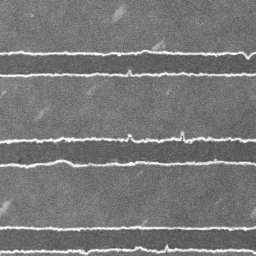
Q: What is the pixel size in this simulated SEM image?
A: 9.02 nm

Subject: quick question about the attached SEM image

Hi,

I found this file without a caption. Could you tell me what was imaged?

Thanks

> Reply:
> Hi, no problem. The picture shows one or a few lines or trenches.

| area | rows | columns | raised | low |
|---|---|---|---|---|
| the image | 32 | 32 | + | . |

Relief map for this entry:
++++++++++++++++++++++++++++++++
++++++++++++++++++++++++++++++++
++++++++++++++++++++++++++++++++
++++++++++++++++++++++++++++++++
++++++++++++++++++++++++++++++++
++++++++++++++++++++++++++++++++
++++++++++++++++++.+++++++++++++
................................
................................
.+..++++++++++++++++++++++++++++
++++++++++++++++++++++++++++++++
++++++++++++++++++++++++++++++++
++++++++++++++++++++++++++++++++
++++++++++++++++++++++++++++++++
++++++++++++++++++++++++++++++++
++++++++++++++++++++++++++++++++
++++++++++++++++++++++++++++++++
+++++++..........++++..+...+..++
................................
................................
.....++++.......++++..+++++++++.
++++++++++++++++++++++++++++++++
++++++++++++++++++++++++++++++++
++++++++++++++++++++++++++++++++
++++++++++++++++++++++++++++++++
++++++++++++++++++++++++++++++++
++++++++++++++++++++++++++++++++
++++++++++++++++++++++++++++++++
..+++.+++++++++.....++++++++++++
................................
................................
....++++++.++++++++++++++++++++.